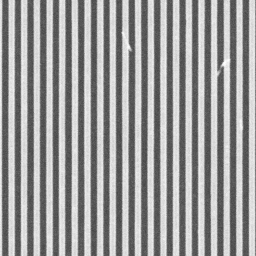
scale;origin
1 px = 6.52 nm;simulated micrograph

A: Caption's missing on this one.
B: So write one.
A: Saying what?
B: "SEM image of parallel lines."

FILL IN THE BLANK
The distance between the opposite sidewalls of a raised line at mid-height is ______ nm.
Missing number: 35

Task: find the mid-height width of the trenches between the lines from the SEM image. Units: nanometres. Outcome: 47.3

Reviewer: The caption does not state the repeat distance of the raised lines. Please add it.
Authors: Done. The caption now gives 82.5 nanometres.